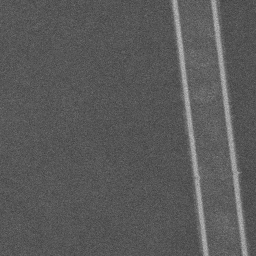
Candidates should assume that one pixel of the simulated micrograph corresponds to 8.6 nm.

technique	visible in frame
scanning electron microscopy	one or a few lines or trenches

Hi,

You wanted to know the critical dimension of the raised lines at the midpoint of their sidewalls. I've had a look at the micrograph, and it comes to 333 nm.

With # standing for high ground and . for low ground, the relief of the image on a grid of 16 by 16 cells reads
...........##...
...........###..
...........###..
...........###..
...........###..
............##..
............##..
............##..
............##..
............###.
............###.
............###.
............###.
.............##.
.............##.
.............##.